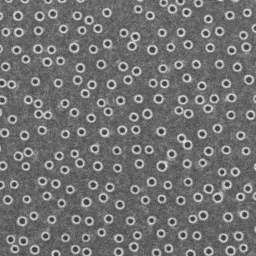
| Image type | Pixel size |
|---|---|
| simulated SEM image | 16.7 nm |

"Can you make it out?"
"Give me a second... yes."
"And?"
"a regular array of holes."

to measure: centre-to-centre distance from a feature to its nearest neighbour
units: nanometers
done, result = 239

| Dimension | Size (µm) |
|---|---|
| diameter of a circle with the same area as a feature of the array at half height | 0.103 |